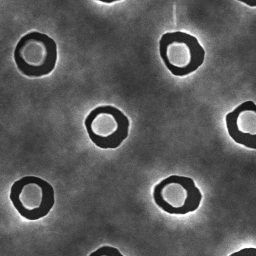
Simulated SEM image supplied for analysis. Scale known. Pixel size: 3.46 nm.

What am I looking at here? ring-shaped grooves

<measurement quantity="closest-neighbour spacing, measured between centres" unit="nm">352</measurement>